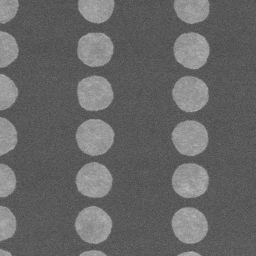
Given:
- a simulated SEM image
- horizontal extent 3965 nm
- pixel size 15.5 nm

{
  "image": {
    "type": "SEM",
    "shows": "a regular array of raised bodies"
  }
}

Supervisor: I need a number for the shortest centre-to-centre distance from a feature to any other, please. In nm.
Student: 674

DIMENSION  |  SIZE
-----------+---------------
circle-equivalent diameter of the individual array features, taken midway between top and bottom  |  546 nm